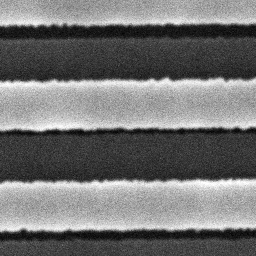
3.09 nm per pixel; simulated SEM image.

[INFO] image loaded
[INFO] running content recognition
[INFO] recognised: lines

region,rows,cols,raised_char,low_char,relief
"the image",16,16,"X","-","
XXXXXXXXXXXXXXXX
XXXXXXXXXX-X----
----------------
----------------
----------------
XXXXXXXXXXXXXXXX
XXXXXXXXXXXXXXXX
XXXXXXXXXXXXXXXX
----------------
----------------
----------------
XXXXXXXXXXXXXXXX
XXXXXXXXXXXXXXXX
XXXXXXXXXXXXXXXX
----------------
----------------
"